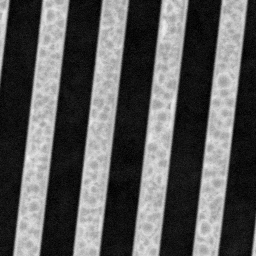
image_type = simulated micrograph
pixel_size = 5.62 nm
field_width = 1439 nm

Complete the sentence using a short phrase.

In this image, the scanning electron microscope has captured parallel lines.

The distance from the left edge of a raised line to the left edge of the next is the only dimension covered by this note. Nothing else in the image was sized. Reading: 0.333 um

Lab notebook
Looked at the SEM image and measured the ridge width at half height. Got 0.138 microns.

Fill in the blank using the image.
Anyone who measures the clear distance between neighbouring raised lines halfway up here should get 0.198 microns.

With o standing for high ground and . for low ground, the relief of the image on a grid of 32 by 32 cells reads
o....ooo.....ooo....ooo.....ooo.
o....ooo.....ooo....ooo.....ooo.
o....ooo.....ooo....ooo.....ooo.
o....ooo.....ooo....ooo....ooo..
o....ooo....ooo.....ooo....ooo..
.....ooo....ooo.....ooo....ooo..
.....ooo....ooo.....ooo....ooo..
.....ooo....ooo....oooo....ooo..
.....oo.....ooo....ooo.....ooo..
....ooo.....ooo....ooo.....ooo..
....ooo.....ooo....ooo.....ooo..
....ooo.....ooo....ooo.....oo...
....ooo....oooo....ooo....ooo...
....ooo....ooo.....ooo....ooo...
....ooo....ooo.....ooo....ooo...
....ooo....ooo.....ooo....ooo...
....ooo....ooo....oooo....ooo...
....oo.....ooo....ooo.....ooo...
...ooo.....ooo....ooo.....ooo...
...ooo.....ooo....ooo.....ooo...
...ooo.....ooo....ooo.....oo....
...ooo....oooo....ooo....ooo....
...ooo....ooo.....ooo....ooo....
...ooo....ooo.....ooo....ooo....
...ooo....ooo.....ooo....ooo....
..oooo....ooo....ooo.....ooo....
..ooo.....ooo....ooo.....ooo....
..ooo.....ooo....ooo.....ooo....
..ooo.....ooo....ooo.....ooo....
..ooo.....ooo....ooo....ooo.....
..ooo....ooo.....ooo....ooo.....
..ooo....ooo.....ooo....ooo.....